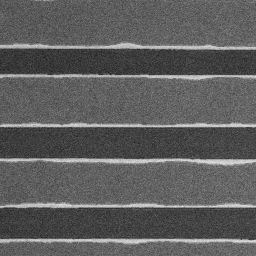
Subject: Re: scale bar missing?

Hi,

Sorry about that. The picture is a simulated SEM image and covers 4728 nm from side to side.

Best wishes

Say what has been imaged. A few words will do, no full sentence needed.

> lines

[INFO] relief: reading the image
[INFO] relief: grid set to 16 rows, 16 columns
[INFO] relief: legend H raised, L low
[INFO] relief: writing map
HHHHHHHHHHHHHHHH
HHHHHHHHHHHHHHHH
HHHHHHHHHHHHHHHH
LLLLLLLLLLLLLLLL
LLLLLLLLLLLLLLLL
HHHHHHHHHHHHHHHH
HHHHHHHHHHHHHHHH
HHHHHHHHHHHHHHHH
LLLLLLLLLLLLLLLL
LLLLLLLLLLLLLLLL
HHHHHHHHHHHHHHHH
HHHHHHHHHHHHHHHH
HHHHHHHHHHHHHHHH
LLLLLLLLLLLLLLLL
LLLLLLLLLLLLLLLL
HHHHHHHHHHHHHHHH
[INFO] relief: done